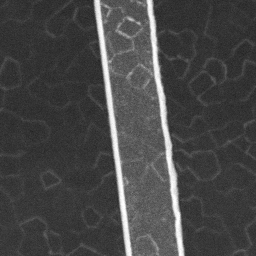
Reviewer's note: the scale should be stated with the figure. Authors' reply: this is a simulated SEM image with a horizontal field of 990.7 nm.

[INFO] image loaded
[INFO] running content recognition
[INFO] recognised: one or a few lines or trenches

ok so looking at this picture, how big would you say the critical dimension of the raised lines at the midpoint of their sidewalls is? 51.6 px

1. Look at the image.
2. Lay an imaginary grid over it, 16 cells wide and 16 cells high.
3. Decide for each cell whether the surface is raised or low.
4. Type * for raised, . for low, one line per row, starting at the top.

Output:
......***.......
......****......
......****......
.......***......
.......***......
.......***......
.......***......
.......***......
.......***......
.......****.....
.......****.....
........***.....
........***.....
........***.....
........***.....
........***.....